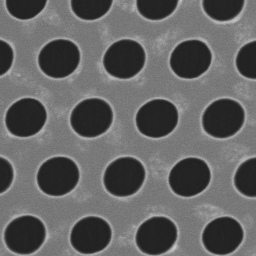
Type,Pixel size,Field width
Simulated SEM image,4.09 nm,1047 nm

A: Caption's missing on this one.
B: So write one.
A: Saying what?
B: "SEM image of a regular array of holes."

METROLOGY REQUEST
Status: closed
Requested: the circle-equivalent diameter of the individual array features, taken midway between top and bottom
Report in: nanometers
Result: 162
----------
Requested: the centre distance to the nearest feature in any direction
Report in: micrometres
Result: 0.269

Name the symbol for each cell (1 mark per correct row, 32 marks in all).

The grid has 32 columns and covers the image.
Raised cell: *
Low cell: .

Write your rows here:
*.....***.....***.....***.....**
*....****....****....*****....**
********************************
********************************
********************************
.*****...*****...*****....*****.
..***.....***.....****....****..
..***.....***.....***.....****..
.****....****.....***.....****..
******..******...*****...******.
********************************
********************************
***.*******..**************..***
*....****.....****....****....**
*.....***.....***.....***......*
*....****.....***.....***.....**
*....*****...*****...*****....**
********************************
********************************
********************************
.****....*****....****....****..
..***.....***.....***.....****..
.****.....***.....***.....***...
.****....****....****.....****..
***********************.*******.
********************************
********************************
**...*****...******..******..***
*.....***.....***.....****....**
*.....***.....***.....***.....**
*....****....****.....****....**
**..******..******...*****...***